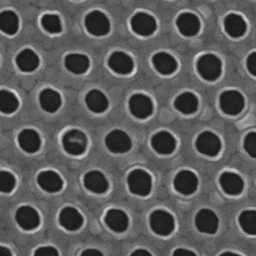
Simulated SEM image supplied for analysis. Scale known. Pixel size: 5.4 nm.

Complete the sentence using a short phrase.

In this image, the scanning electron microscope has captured a regular array of holes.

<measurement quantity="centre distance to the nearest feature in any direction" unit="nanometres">236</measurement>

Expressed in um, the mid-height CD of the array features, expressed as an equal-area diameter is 0.131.